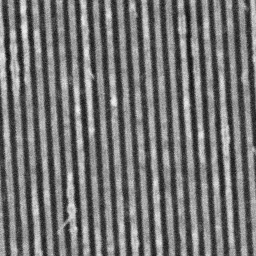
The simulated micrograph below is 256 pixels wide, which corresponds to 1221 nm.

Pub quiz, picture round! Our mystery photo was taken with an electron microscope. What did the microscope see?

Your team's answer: parallel lines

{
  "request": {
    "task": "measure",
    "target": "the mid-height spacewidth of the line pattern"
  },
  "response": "38.1 nanometres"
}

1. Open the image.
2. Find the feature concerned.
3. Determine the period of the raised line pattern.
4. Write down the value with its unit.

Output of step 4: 57.7 nm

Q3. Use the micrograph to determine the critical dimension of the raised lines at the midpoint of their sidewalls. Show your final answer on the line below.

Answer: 20.8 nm